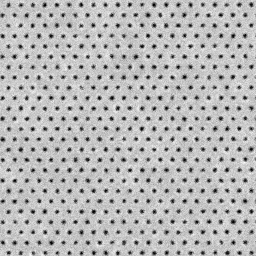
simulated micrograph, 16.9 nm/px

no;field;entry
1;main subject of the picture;a regular array of holes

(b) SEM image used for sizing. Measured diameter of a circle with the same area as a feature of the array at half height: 4.65 px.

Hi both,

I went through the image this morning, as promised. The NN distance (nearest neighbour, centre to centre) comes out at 198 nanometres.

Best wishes